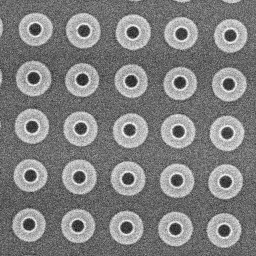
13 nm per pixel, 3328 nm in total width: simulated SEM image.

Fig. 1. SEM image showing an array of small figures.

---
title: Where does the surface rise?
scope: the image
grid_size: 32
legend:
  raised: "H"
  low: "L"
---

LLLLLLLLLLLLLLLLLLLLLLLLLLLLLLLL
LLLLLLLLLLLLLLLLLLLLLLLLLLLLLLLL
LLLHHHLLLHHHLLLHHHLLLLHHLLLLHHLL
LLHHHHHLHHHHHLLHHHHLLHHHHLLHHHHL
LLLHHHLLHHHHLLLHHHHLLHHHHLLHHHHL
LLLHHLLLLHHHLLLHHHLLLHHHLLLHHHHL
LLLLLLLLLLLLLLLLLLLLLLLLLLLLLLLL
LLLLLLLLLLLLLLLLLLLLLLLLLLLLLLLL
LLHHHHLLLHHHLLLHHHLLLLHLLLLLLLLL
LLHHHHLLHHHHLLHHHHLLLHHHLLLHHHLL
LLHHHHLLHHHHLLHHHHLLHHHHHLLHHHHL
LLLHHHLLLHHHLLLHHHLLLHHHLLLHHHHL
LLLLLLLLLLLLLLLLLLLLLLLLLLLLHLLL
LLLLLLLLLLLLLLLLLLLLLLLLLLLLLLLL
LLHHHHLLLHHLLLLHHLLLLHHLLLLLLLLL
LLHHHHLLHHHHLLHHHHLLHHHHLLLHHHLL
LLHHHHLLHHHHLLHHHHLLHHHHLLHHHHLL
LLLHHLLLLHHHLLLHHHLLHHHHLLHHHHLL
LLLLLLLLLLLLLLLLLLLLLLLLLLLHHLLL
LLLLLLLLLLLLLLLLLLLLLLLLLLLLLLLL
LLHHHLLLLHHLLLLHHLLLLLLLLLLLLLLL
LLHHHHLLHHHHLLHHHHLLHHHHLLLHHHLL
LLHHHHLLHHHHLLHHHHLLHHHHLLHHHHLL
LLLHHLLLHHHHLLHHHHLLHHHHLLHHHHLL
LLLLLLLLLLLLLLLLLLLLLHHLLLLHHLLL
LLLLLLLLLLLLLLLLLLLLLLLLLLLLLLLL
LLHHHLLLLHHLLLLHLLLLLLLLLLLLLLLL
LLHHHHLLHHHHLLHHHHLLHHHHLLHHHHLL
LLHHHHLLHHHHLLHHHHLLHHHHLLHHHHLL
LLHHHLLLHHHLLLHHHHLLHHHHLLHHHHLL
LLLLLLLLLLLLLLLHLLLLLHHLLLLHHLLL
LLLLLLLLLLLLLLLLLLLLLLLLLLLLLLLL